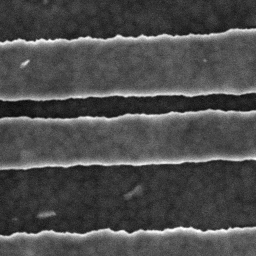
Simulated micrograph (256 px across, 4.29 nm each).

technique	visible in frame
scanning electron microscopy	lines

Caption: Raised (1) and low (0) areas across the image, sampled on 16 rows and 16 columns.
0000000000000000
0000000000000000
0001111111111111
1111111111111111
1111111111111111
1111111111111111
1111111111111111
1111111111111111
1111111111111111
1111111111111111
1100000000000000
0000000000000000
0000000000000000
0000000000000000
0000001111111111
1111111111111111